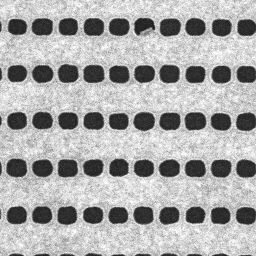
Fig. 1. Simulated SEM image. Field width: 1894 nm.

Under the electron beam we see a regular array of holes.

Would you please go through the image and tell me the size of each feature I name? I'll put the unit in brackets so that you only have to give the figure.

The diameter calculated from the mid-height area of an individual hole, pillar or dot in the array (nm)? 148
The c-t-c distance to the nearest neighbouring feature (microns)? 0.186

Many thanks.